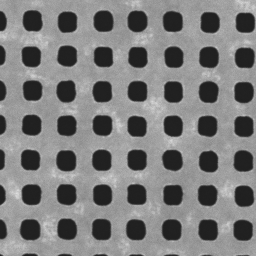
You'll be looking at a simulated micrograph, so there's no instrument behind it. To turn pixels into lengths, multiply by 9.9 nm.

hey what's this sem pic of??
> a regular array of holes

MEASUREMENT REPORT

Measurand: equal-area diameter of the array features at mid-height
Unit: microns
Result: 0.214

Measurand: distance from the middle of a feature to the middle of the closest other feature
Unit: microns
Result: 0.34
